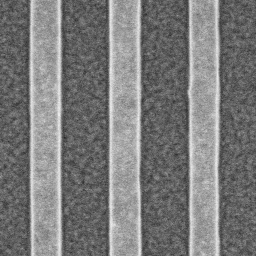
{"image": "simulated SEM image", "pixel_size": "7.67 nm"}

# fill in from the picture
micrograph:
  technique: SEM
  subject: one or a few lines or trenches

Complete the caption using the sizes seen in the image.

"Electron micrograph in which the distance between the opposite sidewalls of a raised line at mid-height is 225 nm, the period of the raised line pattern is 606 nm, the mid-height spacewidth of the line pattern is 383 nm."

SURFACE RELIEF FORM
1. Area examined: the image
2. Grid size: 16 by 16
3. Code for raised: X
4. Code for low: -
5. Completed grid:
--XX---XX---XX--
--XX---XX---XX--
--XX---XX---XX--
--XX---XX---XX--
--XX---XX---XX--
--XX---XX---XX--
--XX---XX---XX--
--XX---XX---XX--
--XX---XX---XX--
--XX---XX---XX--
--XX---XX---XX--
--XX---XX---XX--
--XX---XX---XX--
--XX---XX---XX--
--XX---XX---XX--
--XX---XX---XX--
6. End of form